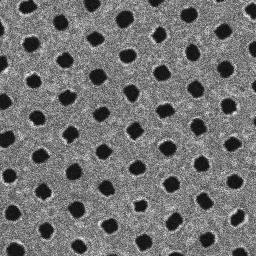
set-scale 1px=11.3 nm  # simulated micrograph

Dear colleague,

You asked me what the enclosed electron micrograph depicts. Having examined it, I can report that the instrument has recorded a regular array of holes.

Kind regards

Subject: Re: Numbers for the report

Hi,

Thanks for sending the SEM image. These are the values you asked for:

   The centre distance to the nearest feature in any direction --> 413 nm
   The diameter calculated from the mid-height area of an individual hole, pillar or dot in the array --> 188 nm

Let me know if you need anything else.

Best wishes